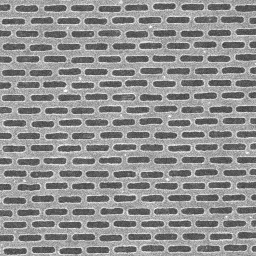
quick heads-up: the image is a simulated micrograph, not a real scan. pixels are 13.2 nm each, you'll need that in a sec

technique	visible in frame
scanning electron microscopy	a regular array of holes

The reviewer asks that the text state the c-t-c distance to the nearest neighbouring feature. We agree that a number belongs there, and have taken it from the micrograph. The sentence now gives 238 nm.